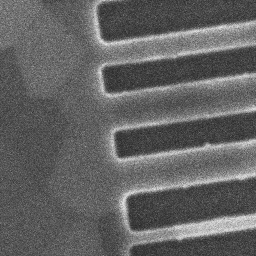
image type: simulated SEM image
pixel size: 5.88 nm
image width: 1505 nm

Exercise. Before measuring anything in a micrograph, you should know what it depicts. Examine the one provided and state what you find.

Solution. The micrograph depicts one or a few lines or trenches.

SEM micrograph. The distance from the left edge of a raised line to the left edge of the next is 0.362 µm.